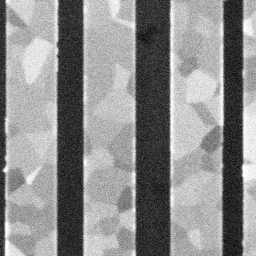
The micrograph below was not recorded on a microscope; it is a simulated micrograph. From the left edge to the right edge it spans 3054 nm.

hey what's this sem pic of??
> lines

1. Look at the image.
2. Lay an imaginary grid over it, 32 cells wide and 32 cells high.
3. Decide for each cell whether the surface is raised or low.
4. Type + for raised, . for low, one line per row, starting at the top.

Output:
.++++++....++++++.....++++++...+
.++++++....++++++....+++++++...+
.++++++....++++++....+++++++...+
.++++++....++++++....+++++++...+
.++++++....++++++....+++++++...+
.++++++....++++++....+++++++...+
.++++++....++++++....+++++++...+
.++++++....++++++....+++++++...+
.++++++....++++++....+++++++...+
.++++++....++++++....+++++++...+
.++++++....++++++....+++++++...+
.++++++....++++++....+++++++...+
.++++++....++++++....+++++++...+
.++++++....++++++....+++++++...+
.++++++....++++++....+++++++...+
.++++++....++++++....+++++++...+
.++++++....++++++....+++++++...+
.++++++....++++++....+++++++...+
.++++++....++++++.....++++++...+
.++++++....++++++....+++++++...+
.++++++....++++++....+++++++...+
.++++++....++++++....+++++++...+
.++++++....++++++....+++++++...+
.++++++....++++++....+++++++...+
.++++++....++++++....+++++++...+
.++++++....++++++....+++++++...+
.++++++....++++++....+++++++...+
.++++++....++++++....+++++++...+
.++++++....++++++....+++++++...+
.++++++....++++++....+++++++...+
.++++++....++++++....+++++++...+
.++++++....++++++....+++++++...+